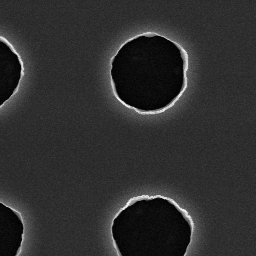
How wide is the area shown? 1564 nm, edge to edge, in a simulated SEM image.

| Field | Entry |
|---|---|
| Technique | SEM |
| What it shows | holes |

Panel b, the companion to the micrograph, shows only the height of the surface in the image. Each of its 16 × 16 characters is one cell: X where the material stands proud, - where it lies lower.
XXXXXXXXXXXXXXXX
XXXXXXXXXXXXXXXX
XXXXXXXX---XXXXX
-XXXXXX----XXXXX
-XXXXXX----XXXXX
-XXXXXX----XXXXX
XXXXXXXX---XXXXX
XXXXXXXXXXXXXXXX
XXXXXXXXXXXXXXXX
XXXXXXXXXXXXXXXX
XXXXXXXXXXXXXXXX
XXXXXXXXXXXXXXXX
XXXXXXXXX-XXXXXX
-XXXXXX-----XXXX
-XXXXXX-----XXXX
-XXXXXX-----XXXX